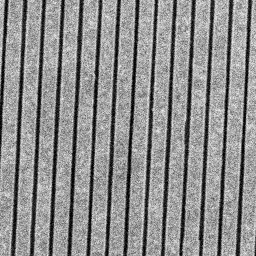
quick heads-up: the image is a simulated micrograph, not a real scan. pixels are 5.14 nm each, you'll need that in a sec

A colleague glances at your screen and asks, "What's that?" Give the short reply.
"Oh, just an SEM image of parallel lines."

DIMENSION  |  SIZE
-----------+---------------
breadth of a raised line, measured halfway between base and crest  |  72.5 nm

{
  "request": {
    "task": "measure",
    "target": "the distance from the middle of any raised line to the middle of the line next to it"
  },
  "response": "0.0963 um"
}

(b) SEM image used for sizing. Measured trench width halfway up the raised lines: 0.0244 micrometres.